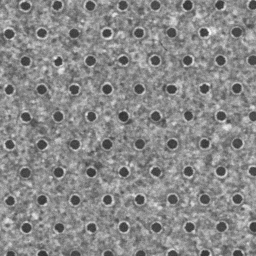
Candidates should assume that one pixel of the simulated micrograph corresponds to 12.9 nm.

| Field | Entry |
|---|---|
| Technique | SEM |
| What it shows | a regular array of holes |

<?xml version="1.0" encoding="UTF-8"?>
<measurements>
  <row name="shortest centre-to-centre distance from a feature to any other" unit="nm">410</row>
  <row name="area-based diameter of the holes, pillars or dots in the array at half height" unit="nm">133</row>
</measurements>